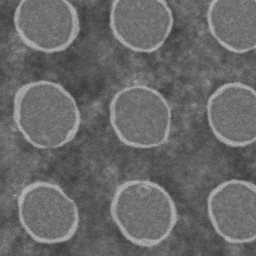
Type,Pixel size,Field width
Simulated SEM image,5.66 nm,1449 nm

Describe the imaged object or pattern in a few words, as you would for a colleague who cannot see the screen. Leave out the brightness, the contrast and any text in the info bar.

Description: raised bodies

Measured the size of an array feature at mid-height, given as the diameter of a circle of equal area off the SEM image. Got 345 nm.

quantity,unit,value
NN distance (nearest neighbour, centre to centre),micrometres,0.536